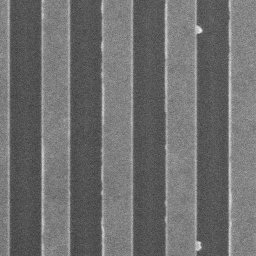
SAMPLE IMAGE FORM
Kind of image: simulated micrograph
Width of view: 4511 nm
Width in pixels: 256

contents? lines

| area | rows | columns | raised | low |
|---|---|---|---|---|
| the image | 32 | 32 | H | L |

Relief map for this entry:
HLLLLHHHHLLLLHHHLLLLLHHHLLLLLHHH
HLLLLHHHHLLLLHHHLLLLLHHHLLLLLHHH
HLLLLHHHHLLLLHHHLLLLLHHHLLLLLHHH
HLLLLHHHHLLLLHHHLLLLLHHHLLLLLHHH
HLLLLHHHHLLLLHHHLLLLLHHHLLLLLHHH
HLLLLHHHHLLLLHHHLLLLLHHHLLLLLHHH
HLLLLHHHHLLLLHHHLLLLLHHHLLLLLHHH
HLLLLHHHHLLLLHHHLLLLLHHHLLLLLHHH
HLLLLHHHHLLLLHHHLLLLLHHHLLLLLHHH
HLLLLHHHHLLLLHHHLLLLLHHHLLLLLHHH
HLLLLHHHHLLLLHHHLLLLLHHHLLLLLHHH
HLLLLHHHHLLLLHHHLLLLLHHHLLLLLHHH
HLLLLHHHHLLLLHHHLLLLLHHHLLLLLHHH
HLLLLHHHHLLLLHHHLLLLLHHHLLLLLHHH
HLLLLHHHHLLLLHHHLLLLLHHHLLLLLHHH
HLLLLHHHHLLLLHHHLLLLLHHHLLLLLHHH
HLLLLHHHHLLLLHHHLLLLLHHHLLLLLHHH
HLLLLHHHHLLLLHHHLLLLLHHHLLLLLHHH
HLLLLHHHHLLLLHHHLLLLLHHHLLLLLHHH
HLLLLHHHHLLLLHHHLLLLLHHHLLLLLHHH
HLLLLHHHHLLLLHHHLLLLLHHHLLLLLHHH
HLLLLHHHHLLLLHHHLLLLLHHHLLLLLHHH
HLLLLHHHHLLLLHHHLLLLLHHHLLLLLHHH
HLLLLHHHHLLLLHHHLLLLLHHHLLLLLHHH
HLLLLHHHHLLLLHHHLLLLLHHHLLLLLHHH
HLLLLHHHHLLLLHHHLLLLLHHHLLLLLHHH
HLLLLHHHHLLLLHHHLLLLLHHHLLLLLHHH
HLLLLHHHHLLLLHHHLLLLLHHHLLLLLHHH
HLLLLHHHHLLLLHHHLLLLLHHHLLLLLHHH
HLLLLHHHHLLLLHHHLLLLLHHHLLLLLHHH
HLLLLHHHHLLLLHHHLLLLLHHHLLLLLHHH
HLLLLHHHHLLLLHHHLLLLLHHHLLLLLHHH